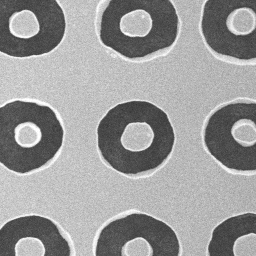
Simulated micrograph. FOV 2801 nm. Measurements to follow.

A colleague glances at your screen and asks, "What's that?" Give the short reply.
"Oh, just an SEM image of ring-shaped grooves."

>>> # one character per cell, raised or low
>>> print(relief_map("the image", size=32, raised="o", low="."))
.......oooooo.........oooo......
..oo....oooo....oo....ooo....oo.
.oooo...oooo...oooo...ooo....ooo
.oooo...oooo...oooo...ooo....ooo
..oo....oooo....oo....ooo.......
.......oooooo.........oooo......
......ooooooooo.....oooooo......
oooooooooooooooo..ooooooooooo...
oooooooooooooooooooooooooooooooo
oooooooooooooooooooooooooooooooo
oooooooooooooooooooooooooooooooo
oooooooooooooooooooooooooooooooo
oooooooooooooooooooooooooooooo.o
......oooooooo......ooooooo.....
.......oooooo........ooooo......
...o....oooo....oo...ooooo...ooo
..ooo...oooo...oooo...ooo....ooo
..ooo...oooo...oooo...ooo.....oo
.......ooooo....oo....oooo......
.......oooooo........oooooo.....
......ooooooo.......oooooooo....
oo..ooooooooooo....ooooooooooooo
oooooooooooooooooooooooooooooooo
oooooooooooooooooooooooooooooooo
oooooooooooooooooooooooooooooooo
oooooooooooooooooooooooooooooooo
oooooooooooooooooooooooooooooooo
oo....oooooooo......oooooooo....
........ooooo........oooooo.....
........oooo..........ooooo...oo
..ooo....ooo....ooo...oooo...ooo
..oooo...ooo....ooo...oooo...ooo